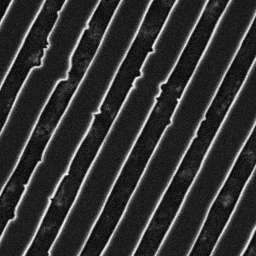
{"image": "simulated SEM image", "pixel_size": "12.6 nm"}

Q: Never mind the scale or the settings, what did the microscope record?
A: parallel lines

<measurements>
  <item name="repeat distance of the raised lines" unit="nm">612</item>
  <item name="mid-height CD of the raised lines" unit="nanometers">362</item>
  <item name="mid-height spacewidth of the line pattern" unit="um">0.255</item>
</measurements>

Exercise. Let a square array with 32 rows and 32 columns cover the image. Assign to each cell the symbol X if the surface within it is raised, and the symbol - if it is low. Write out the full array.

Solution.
-XXXX---XXXX---XXXX---XXXX---XXX
-XXXX--XXXXX--XXXX---XXXX---XXXX
XXXX---XXXX---XXXX---XXXX--XXXXX
XXXX---XXXX--XXXX---XXXX---XXXX-
XXX---XXXX---XXXX---XXXX---XXXX-
XXX---XXXX---XXX---XXXX---XXXX--
XX----XXX---XXXX---XXXX---XXXX--
XX---XXXX---XXX---XXXX---XXXX---
X---XXXXX--XXXX---XXXX--XXXXX--X
X--XXXXX---XXX---XXXX---XXXX---X
---XXXX---XXXX---XXX---XXXXX--XX
--XXXXX--XXXX---XXXX---XXXX---XX
--XXXX---XXXX---XXX---XXXXX--XXX
--XXX---XXXX---XXXX---XXXX---XXX
-XXXX---XXXX---XXXX---XXXX--XXXX
-XXX---XXXX---XXXX---XXXX---XXXX
XXXX---XXXX---XXXX---XXXX--XXXX-
XXXX--XXXX---XXXX---XXXX---XXXX-
XXX---XXXX---XXXX---XXX---XXXX--
XXX--XXXX---XXXX---XXXX---XXXX--
XX---XXXX---XXX---XXXX---XXXX---
XX--XXXX---XXXX---XXXX---XXXX---
X---XXXX---XXX---XXXX---XXXX---X
---XXXX---XXXX---XXXX---XXXX---X
---XXXX---XXXX--XXXX---XXXX---XX
--XXXX---XXXX---XXXX---XXXX---XX
--XXXX---XXXX---XXX---XXXX---XXX
-XXXX---XXXX---XXXX---XXXX---XXX
-XXXX---XXXX--XXXX---XXXX---XXXX
XXXX---XXXX---XXXX---XXXX---XXX-
XXXX---XXXX--XXXX---XXXX---XXXX-
XXX---XXXX---XXXX---XXXX---XXX--